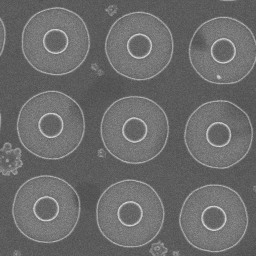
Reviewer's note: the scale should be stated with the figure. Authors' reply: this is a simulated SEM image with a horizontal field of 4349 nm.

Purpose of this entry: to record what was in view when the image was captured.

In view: an array of small figures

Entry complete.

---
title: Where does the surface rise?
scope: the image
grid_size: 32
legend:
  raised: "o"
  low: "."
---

oooooooooooooooooooooooooooooooo
ooooo....ooooooooooooooooooooooo
oooo......ooooo.....oooooo...ooo
.oo........ooo.......oooo......o
.oo...oo...oo....o...ooo........
ooo...oo...oo...ooo...oo...oo...
ooo...oo...oo...ooo...oo..ooo...
oooo......oooo.......ooo...oo...
ooooo....ooooo......oooo.......o
oooooooooooooooo...oooooo......o
oooooooooooooooooooooooooooooooo
oooooo.ooooooooooooooooooooooooo
oooo.....oooooo....ooooooooooooo
ooo.......oooo......ooooo.....oo
oo...oo...ooo........ooo.......o
oo...ooo..ooo...oo...oo....o...o
oo...ooo..ooo..ooo...oo...ooo...
ooo.......ooo...oo...oo...ooo..o
ooo......oooo.......ooo........o
ooooo...oooooo.....ooooo.......o
ooooooooooooooooooooooooo....ooo
oooooooooooooooooooooooooooooooo
oooo....oooooooooooooooooooooooo
ooo......ooooo.....oooooo...oooo
oo........ooo.......oooo......oo
oo..ooo...oo...oo...ooo.......oo
oo..ooo...oo...ooo..ooo...oo...o
oo...o....oo...ooo..ooo..ooo...o
oo.......ooo........ooo...oo...o
ooo.....ooooo......oooo.......oo
ooooooooooooooo...oooooo.....ooo
oooooooooooooooooooooooooooooooo